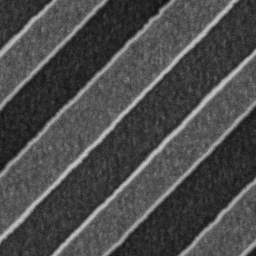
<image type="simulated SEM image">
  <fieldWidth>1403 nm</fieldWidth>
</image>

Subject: lines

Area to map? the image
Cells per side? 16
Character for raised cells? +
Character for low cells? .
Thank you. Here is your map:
...+++....++++..
..+++....++++...
.+++....++++....
+++....++++.....
++....++++.....+
+....++++.....++
....++++.....+++
...++++.....+++.
..++++.....+++..
.++++.....+++...
++++.....+++....
++++....+++.....
++.....+++.....+
++....+++.....++
+....+++.....+++
....+++.....++++